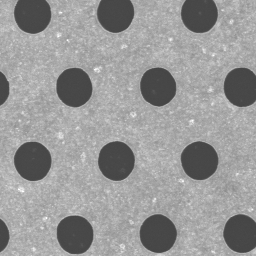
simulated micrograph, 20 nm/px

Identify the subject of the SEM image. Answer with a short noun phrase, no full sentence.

holes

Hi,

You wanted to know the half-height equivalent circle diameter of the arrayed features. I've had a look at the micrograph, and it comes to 758 nm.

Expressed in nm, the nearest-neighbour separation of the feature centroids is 1660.